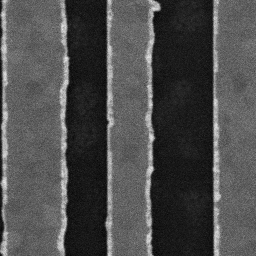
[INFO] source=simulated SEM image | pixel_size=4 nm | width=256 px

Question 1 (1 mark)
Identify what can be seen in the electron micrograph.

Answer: one or a few lines or trenches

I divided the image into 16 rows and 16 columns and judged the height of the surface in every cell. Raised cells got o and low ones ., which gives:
oooo...ooo...ooo
oooo...oo....ooo
oooo...ooo...ooo
oooo...oo....ooo
oooo...oo....ooo
oooo...oo....ooo
oooo...ooo...ooo
oooo...oo....ooo
oooo...ooo...ooo
oooo...ooo...ooo
oooo...ooo...ooo
oooo...oo....ooo
oooo...oo....ooo
oooo...oo....ooo
oooo...oo....ooo
oooo...oo....ooo